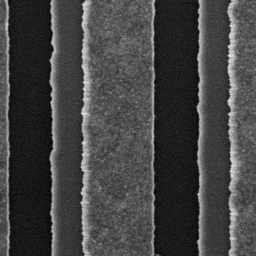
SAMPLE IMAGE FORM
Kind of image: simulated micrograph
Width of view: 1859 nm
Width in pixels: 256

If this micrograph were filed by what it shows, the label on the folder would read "lines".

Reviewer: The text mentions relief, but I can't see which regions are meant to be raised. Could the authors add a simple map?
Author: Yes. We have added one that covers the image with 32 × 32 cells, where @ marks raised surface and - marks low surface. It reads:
@-----@@@@@@@@@@@@@------@@@@@@@
@-----@@@@@@@@@@@@@------@@@@@@@
@-----@@@@@@@@@@@@@------@@@@@@@
@-----@@@@@@@@@@@@@------@@@@@@@
@------@@@@@@@@@@@@------@@@@@@@
@------@@@@@@@@@@@@------@@@@@@@
@------@@@@@@@@@@@@------@@@@@@@
@-----@@@@@@@@@@@@@------@@@@@@@
@-----@@@@@@@@@@@@@------@@@@@@@
@-----@@@@@@@@@@@@@------@@@@@@@
@-----@@@@@@@@@@@@@------@@@@@@@
@-----@@@@@@@@@@@@@------@@@@@@@
@-----@@@@@@@@@@@@@------@@@@@@@
@-----@@@@@@@@@@@@@------@@@@@@@
@------@@@@@@@@@@@@------@@@@@@@
@------@@@@@@@@@@@@------@@@@@@@
@------@@@@@@@@@@@@------@@@@@@@
@------@@@@@@@@@@@@------@@@@@@@
@------@@@@@@@@@@@@------@@@@@@@
@-----@@@@@@@@@@@@@------@@@@@@@
@-----@@@@@@@@@@@@@------@@@@@@@
@-----@@@@@@@@@@@@@------@@@@@@@
@------@@@@@@@@@@@@------@@@@@@@
@-----@@@@@@@@@@@@@------@@@@@@@
@------@@@@@@@@@@@@------@@@@@@@
@-----@@@@@@@@@@@@@------@@@@@@@
@-----@@@@@@@@@@@@@------@@@@@@@
@------@@@@@@@@@@@@------@@@@@@@
@-----@@@@@@@@@@@@@------@@@@@@@
@------@@@@@@@@@@@@------@@@@@@@
@-----@@@@@@@@@@@@@------@@@@@@@
@-----@@@@@@@@@@@@@------@@@@@@@